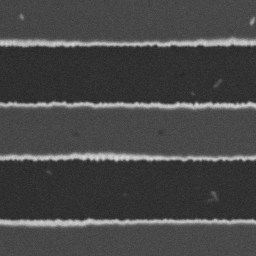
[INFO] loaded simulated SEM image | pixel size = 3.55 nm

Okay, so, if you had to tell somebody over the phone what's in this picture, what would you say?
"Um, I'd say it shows lines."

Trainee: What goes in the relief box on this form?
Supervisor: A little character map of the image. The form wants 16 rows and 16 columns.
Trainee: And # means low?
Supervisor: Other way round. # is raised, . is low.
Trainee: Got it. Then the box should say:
################
################
################
................
................
................
##########.#...#
################
################
################
................
................
................
................
################
################